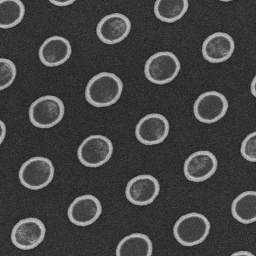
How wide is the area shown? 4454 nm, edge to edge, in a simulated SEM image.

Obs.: a regular array of raised bodies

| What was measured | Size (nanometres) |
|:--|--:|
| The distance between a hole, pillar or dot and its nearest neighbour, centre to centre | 1060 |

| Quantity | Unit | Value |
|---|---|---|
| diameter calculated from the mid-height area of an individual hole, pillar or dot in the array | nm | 516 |